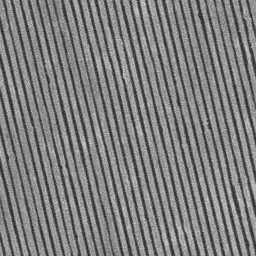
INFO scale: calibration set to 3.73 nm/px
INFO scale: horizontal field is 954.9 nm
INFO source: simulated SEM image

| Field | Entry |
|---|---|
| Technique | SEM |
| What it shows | parallel lines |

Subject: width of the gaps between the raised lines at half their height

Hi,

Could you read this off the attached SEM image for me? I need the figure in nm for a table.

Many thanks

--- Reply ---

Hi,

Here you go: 10.9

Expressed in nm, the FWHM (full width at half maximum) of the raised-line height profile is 18.1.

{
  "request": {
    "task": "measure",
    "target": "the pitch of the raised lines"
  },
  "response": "30.5 nm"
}